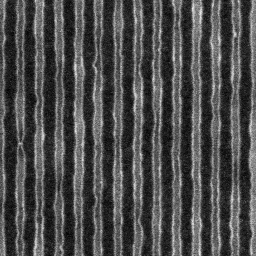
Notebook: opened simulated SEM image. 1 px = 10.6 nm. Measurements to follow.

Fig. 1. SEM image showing parallel lines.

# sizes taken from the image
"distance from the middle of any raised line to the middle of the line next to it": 19.6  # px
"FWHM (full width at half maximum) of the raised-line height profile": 0.151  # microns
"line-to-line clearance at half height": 59.7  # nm